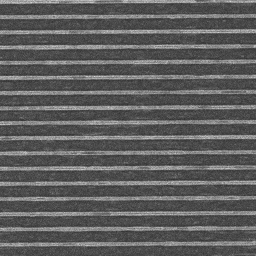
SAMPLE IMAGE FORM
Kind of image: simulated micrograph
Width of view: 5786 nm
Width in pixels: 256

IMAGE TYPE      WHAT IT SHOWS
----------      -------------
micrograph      parallel lines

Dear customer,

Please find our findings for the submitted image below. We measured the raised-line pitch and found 343 nanometres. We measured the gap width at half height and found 0.274 micrometres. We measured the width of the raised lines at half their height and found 62.1 nanometres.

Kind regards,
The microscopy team